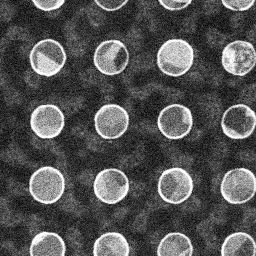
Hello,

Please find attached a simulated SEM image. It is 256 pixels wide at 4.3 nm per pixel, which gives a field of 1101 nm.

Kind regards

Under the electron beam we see a regular array of raised bodies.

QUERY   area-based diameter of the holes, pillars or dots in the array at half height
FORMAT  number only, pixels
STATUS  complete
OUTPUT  33.4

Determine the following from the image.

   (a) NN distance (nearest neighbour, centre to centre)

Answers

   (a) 274 nanometres